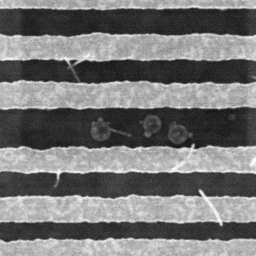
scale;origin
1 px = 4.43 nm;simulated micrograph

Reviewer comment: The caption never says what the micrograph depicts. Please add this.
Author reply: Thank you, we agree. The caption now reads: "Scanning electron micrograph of lines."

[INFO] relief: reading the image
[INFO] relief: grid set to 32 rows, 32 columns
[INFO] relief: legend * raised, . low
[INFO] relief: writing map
********************************
................................
................................
................................
***..***.*********************.*
********************************
********************************
*.*.....******...**.....*.**...*
................................
................................
***********.********.**.***..*.*
********************************
********************************
*........**................*....
................................
................................
................................
................................
..*.....***...**.*.**.....**.***
********************************
********************************
..***.*****...**.***.***...*.***
................................
................................
.........*......*.....*..*......
********************************
********************************
********************************
................................
................................
********************************
********************************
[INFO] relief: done